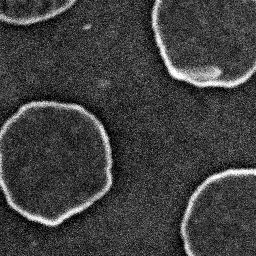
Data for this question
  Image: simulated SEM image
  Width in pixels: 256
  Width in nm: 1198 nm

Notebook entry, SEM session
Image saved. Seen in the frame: raised bodies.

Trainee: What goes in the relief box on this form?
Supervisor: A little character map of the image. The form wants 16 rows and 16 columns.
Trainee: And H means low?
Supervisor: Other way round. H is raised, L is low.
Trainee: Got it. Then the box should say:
LLHHLLLLLLHHHHHH
LLLLLLLLLLHHHHHH
LLLLLLLLLLHHHHHH
LLLLLLLLLLHHHHHH
LLLLLLLLLLLHHHHH
LLLLLLLLLLLLLLLL
LLHHLLLLLLLLLLLL
LHHHHHLLLLLLLLLL
HHHHHHHLLLLLLLLL
HHHHHHHLLLLLLLLL
HHHHHHHLLLLLLLLL
HHHHHHHLLLLLLHHH
LHHHHHLLLLLLHHHH
LLHHLLLLLLLLHHHH
LLLLLLLLLLLHHHHH
LLLLLLLLLLLLHHHH